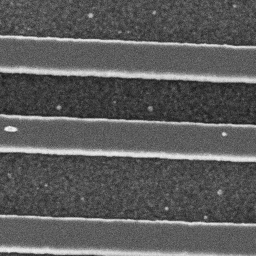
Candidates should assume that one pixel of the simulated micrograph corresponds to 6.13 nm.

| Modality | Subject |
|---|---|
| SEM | lines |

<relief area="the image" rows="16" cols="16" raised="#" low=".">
................
................
#######.........
################
################
................
................
########........
################
..##############
................
................
................
#...............
################
################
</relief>